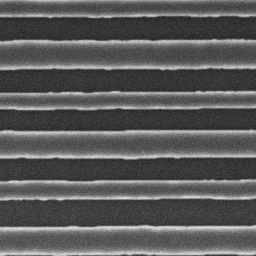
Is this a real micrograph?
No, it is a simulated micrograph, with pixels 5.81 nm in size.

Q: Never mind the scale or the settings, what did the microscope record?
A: lines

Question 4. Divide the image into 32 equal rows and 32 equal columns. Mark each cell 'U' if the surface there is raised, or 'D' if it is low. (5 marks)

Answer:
UUUUUUUUUUUUUUUUUUUUUUUUUUUUUUUU
UUUUUUUUUUUUUUUUUUUUUUUUUUUUUUUU
DDDDDDDDDDDDDDDDDDDDDDDDDDDDDDDD
DDDDDDDDDDDDDDDDDDDDDDDDDDDDDDDD
DDDDDDDDDDDDDDDDDDDDDDDDDDDDDDDD
UUUUUUUUUUUUUUUUUUUUUUUUUUUUUUUU
UUUUUUUUUUUUUUUUUUUUUUUUUUUUUUUU
UUUUUUUUUUUUUUUUUUUUUUUUUUUUUUUU
UUUUUUUUUDUUUUUUUUUUUUUUUUDDDDDD
DDDDDDDDDDDDDDDDDDDDDDDDDDDDDDDD
DDDDDDDDDDDDDDDDDDDDDDDDDDDDDDDD
DDDDDDDDDDDDDUUDDDDDDDDDDDDUDUUU
UUUUUUUUUUUUUUUUUUUUUUUUUUUUUUUU
UUUUUUUUUUUUUUUUUUUUUUUUUDDDDDDD
DDDDDDDDDDDDDDDDDDDDDDDDDDDDDDDD
DDDDDDDDDDDDDDDDDDDDDDDDDDDDDDDD
UUUUDUUUUUUUUUUUUUUUUUUUUUUUUUUU
UUUUUUUUUUUUUUUUUUUUUUUUUUUUUUUU
UUUUUUUUUUUUUUUUUUUUUUUUUUUUUUUU
UUUUUUUUUUUUUUUUUUUUUUUUUUUUUUUU
DDDDDDDDDDDDDDDDDDDDDDDDDDDDDDDD
DDDDDDDDDDDDDDDDDDDDDDDDDDDDDDDD
DDDDDDDDDDDDDDDDDDDDDDDDDDDDDDDD
UUUUUUUUUUUUUUUUUUUUUUUUUUUUUUUU
UUUUUUUUUUUUUUUUUUUUUUUUUUUUUUUU
DDDDDDDDDDDDDDDDDDDDDDDDDDDDDDDD
DDDDDDDDDDDDDDDDDDDDDDDDDDDDDDDD
DDDDDDDDDDDDDDDDDDDDDDDDDDDDDDDD
UUUUUUUUUUUUUUUUUUUUUUUUUUUUUUUU
UUUUUUUUUUUUUUUUUUUUUUUUUUUUUUUU
UUUUUUUUUUUUUUUUUUUUUUUUUUUUUUUU
UUUUUUUUUUUUUUUUUUUUUUUUUUUUUUUU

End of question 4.